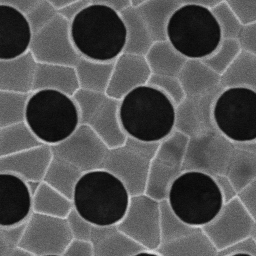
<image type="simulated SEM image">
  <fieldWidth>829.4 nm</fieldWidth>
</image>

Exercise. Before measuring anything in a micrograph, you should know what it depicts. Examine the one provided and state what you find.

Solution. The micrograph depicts holes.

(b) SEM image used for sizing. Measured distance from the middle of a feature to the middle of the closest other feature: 307 nanometres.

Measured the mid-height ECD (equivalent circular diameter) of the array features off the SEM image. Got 172 nanometres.